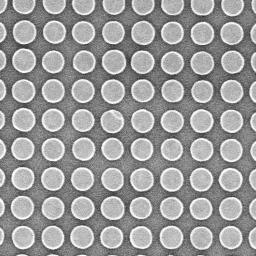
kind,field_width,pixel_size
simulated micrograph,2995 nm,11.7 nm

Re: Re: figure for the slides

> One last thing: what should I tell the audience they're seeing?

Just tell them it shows a regular array of raised bodies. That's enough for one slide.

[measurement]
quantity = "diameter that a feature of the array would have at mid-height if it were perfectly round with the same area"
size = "260 nanometres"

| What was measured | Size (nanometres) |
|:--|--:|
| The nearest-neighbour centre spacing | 337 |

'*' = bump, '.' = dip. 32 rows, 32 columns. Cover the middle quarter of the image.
..******..*****..*****..******..
...****....****...****...****...
................................
................................
...***.....***....***....****...
..*****...*****..*****...****...
..******..*****..*****...*****..
..******..*****..*****...*****..
...****...*****...****...****...
...........***..................
................................
....*...........................
...****...****....****...****...
..*****..******..*****..******..
..*****..******..*****..******..
...****..******..*****...*****..
...***....****....***....****...
................................
................................
...****...****....****...****...
..*****...*****..*****..*****...
..*****...*****..*****..******..
...****...*****..*****...****...
...***.....***....***.....**....
................................
................................
...***.....**.....***.....**....
..*****...****...*****...****...
..*****...*****..*****..******..
..*****...*****..*****..******..
..*****...*****..*****...****...
....*.......*......*......**....